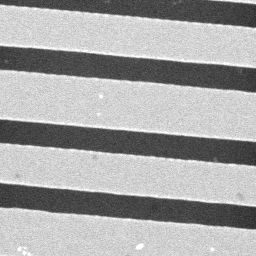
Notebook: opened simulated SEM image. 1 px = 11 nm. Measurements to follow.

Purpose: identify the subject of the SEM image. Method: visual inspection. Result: lines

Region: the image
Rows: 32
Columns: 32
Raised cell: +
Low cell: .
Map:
................................
+++++++++.......................
++++++++++++++++++++............
++++++++++++++++++++++++++++++++
++++++++++++++++++++++++++++++++
++++++++++++++++++++++++++++++++
..........++++++++++++++++++++++
.....................+++++++++++
................................
+++++++++.......................
++++++++++++++++++++............
+++++++++++++++++++++++++++++++.
++++++++++++++++++++++++++++++++
++++++++++++++++++++++++++++++++
++++++++++++++++++++++++++++++++
.......+++++++++++++++++++++++++
..................++++++++++++++
..............................++
+++++++.........................
+++++++++++++++++...............
++++++++++++++++++++++++++++....
++++++++++++++++++++++++++++++++
++++++++++++++++++++++++++++++++
.......+++++++++++++++++++++++++
..................++++++++++++++
.............................+++
++++++..........................
++++++++++++++++++..............
+++++++++++++++++++++++++++++...
++++++++++++++++++++++++++++++++
++++++++++++++++++++++++++++++++
++++++++++++++++++++++++++++++++